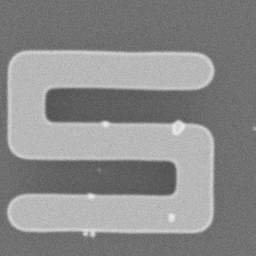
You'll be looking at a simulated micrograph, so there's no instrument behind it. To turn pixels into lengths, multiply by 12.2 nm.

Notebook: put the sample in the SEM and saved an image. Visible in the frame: groups of lines, slits or small figures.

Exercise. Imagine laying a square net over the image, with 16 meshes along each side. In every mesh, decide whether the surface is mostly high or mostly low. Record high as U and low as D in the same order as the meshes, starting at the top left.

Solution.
DDDDDDDDDDDDDDDD
DDDDDDDDDDDDDDDD
DDDDDDDDDDDDDDDD
DUUUUUUUUUUUUDDD
DUUUUUUUUUUUUDDD
DUUDDDDDUUUUDDDD
DUUDDDDDDDDDDDDD
DUUDDDDDDDDDDDDD
DUUUUUUUUUUUUDDD
DUUUUUUUUUUUUDDD
DDDDDDDDDDDUUDDD
DDDDDDDDDDDUUDDD
DUUUUUUUUUUUUDDD
DUUUUUUUUUUUUDDD
DDDDDDDDDDDUDDDD
DDDDDDDDDDDDDDDD